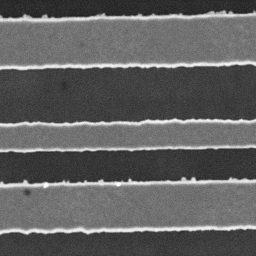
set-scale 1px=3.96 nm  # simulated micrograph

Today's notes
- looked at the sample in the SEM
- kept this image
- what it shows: lines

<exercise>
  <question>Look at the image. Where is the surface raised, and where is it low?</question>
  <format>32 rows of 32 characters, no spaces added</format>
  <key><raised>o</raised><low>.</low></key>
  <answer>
................................
................................
oooooooooooooooooooooooooooooooo
oooooooooooooooooooooooooooooooo
oooooooooooooooooooooooooooooooo
oooooooooooooooooooooooooooooooo
oooooooooooooooooooooooooooooooo
oooooooooooooooooooooooooooooooo
oooooo..........................
................................
................................
................................
................................
................................
................................
..ooooo.oooooooooooooooooooooooo
oooooooooooooooooooooooooooooooo
oooooooooooooooooooooooooooooooo
oooooooooooooooooooooooooooo....
................................
................................
................................
................................
oooooooooooooooooooooooooooooooo
oooooooooooooooooooooooooooooooo
oooooooooooooooooooooooooooooooo
oooooooooooooooooooooooooooooooo
oooooooooooooooooooooooooooooooo
oooooooooooooooooooooooooooooooo
................................
................................
................................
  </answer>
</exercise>